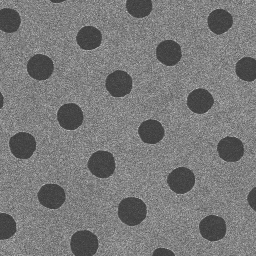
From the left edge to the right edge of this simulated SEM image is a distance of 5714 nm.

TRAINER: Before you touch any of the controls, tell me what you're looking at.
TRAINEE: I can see a regular array of holes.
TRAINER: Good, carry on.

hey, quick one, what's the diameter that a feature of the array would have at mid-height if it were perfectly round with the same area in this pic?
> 0.6 microns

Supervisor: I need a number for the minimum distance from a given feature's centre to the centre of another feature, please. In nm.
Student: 1270